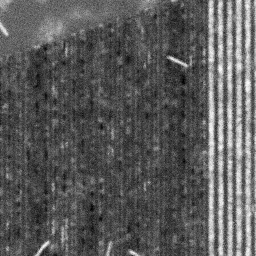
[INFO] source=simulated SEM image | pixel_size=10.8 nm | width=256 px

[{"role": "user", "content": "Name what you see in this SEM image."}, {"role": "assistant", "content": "parallel lines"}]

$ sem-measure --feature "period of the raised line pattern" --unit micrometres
0.0998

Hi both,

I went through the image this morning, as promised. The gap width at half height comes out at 63.8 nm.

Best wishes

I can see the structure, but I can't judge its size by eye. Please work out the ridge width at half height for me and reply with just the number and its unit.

36.6 nm